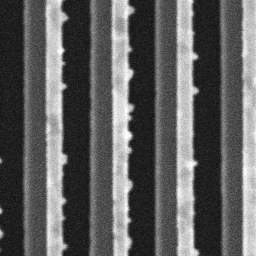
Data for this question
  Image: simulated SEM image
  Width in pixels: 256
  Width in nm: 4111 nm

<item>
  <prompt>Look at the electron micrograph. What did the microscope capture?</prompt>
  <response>lines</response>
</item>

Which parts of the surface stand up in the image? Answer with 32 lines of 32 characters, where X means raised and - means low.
---XXXXX---XXXXX----XXXX----XXXX
---XXXXX---XXXXXX---XXXX----XXXX
---XXXXX----XXXX----XXXX----XXXX
---XXXXX---XXXXX----XXXX----XXXX
---XXXXX----XXXX----XXXX----XXXX
---XXXXX----XXXX----XXXX----XXXX
---XXXXX---XXXXX----XXXX----XXXX
---XXXXX---XXXXX----XXXX----XXXX
---XXXXX---XXXXX----XXXX----XXXX
---XXXXX---XXXXX----XXXX----XXXX
---XXXXX---XXXXX----XXXX----XXXX
---XXXXX---XXXXX----XXXXX---XXXX
---XXXXX---XXXXX----XXXX----XXXX
---XXXXX----XXXXX---XXXX----XXXX
---XXXXX---XXXXX----XXXX----XXXX
---XXXXX---XXXXX----XXXX----XXXX
---XXXXX----XXXX----XXXX----XXXX
---XXXXX---XXXXX----XXXX----XXXX
---XXXXX---XXXXX----XXXX----XXXX
---XXXXX---XXXXX----XXXX----XXXX
---XXXXX---XXXXX----XXXX----XXXX
---XXXXX---XXXXX----XXXX----XXXX
---XXXXX---XXXXX----XXXX----XXXX
---XXXXX---XXXXX----XXXX----XXXX
---XXXXX---XXXXX----XXXX----XXXX
---XXXXX---XXXXX----XXXX----XXXX
---XXXXX---XXXXX----XXXX----XXXX
---XXXXX---XXXXX----XXXX----XXXX
---XXXXX---XXXXX----XXXX----XXXX
---XXXXX---XXXXX----XXXX----XXXX
---XXXXX---XXXXX----XXXX----XXXX
---XXXXX---XXXXX----XXXXX---XXXX